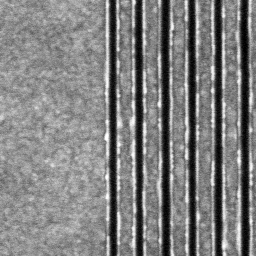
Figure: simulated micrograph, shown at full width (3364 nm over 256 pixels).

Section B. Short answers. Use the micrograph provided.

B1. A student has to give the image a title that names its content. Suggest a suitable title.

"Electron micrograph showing parallel lines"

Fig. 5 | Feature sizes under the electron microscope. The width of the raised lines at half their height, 0.166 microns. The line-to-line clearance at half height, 187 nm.